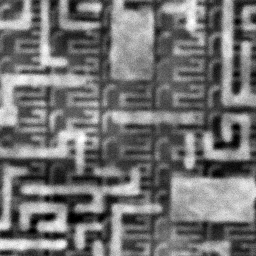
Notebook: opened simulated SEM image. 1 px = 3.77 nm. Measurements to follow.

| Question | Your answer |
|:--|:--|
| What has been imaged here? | wiring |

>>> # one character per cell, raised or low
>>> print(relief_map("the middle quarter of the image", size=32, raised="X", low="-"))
------------XXXXXXXXXX----------
------------XXXXXXXXXX----------
------------XXXXXXXXXX----------
XXXXX-------XXXXXXXXXX----------
XXXXX---------------------------
--------------------------------
--------------------------------
--------------------------------
--------------------------------
--------------------------------
--------------------------------
--------------------------------
------------XXXXXXXXXXXXXXXXXXXX
------------XXXXXXXXXXXXXXXXXXXX
-------------XXXXXXXXXXX-XXXXXXX
--------------------------------
--------------------------------
XXXXX--------------------------X
XXXXX--------------------------X
X--XX--------------------------X
---XX--------------------------X
---XX--------------------------X
---XX--------------------------X
---XX-------------------------XX
---XX-------------------------XX
---XX-------------------------XX
---XX---XXXXXX---XX-------------
--------XXXXXX---XX-------------
-----------------XX-------------
-----------------XX--------XXXXX
----------------XXX--------XXXXX
XXXXXXXXXXXXXXXXXXX--------XXXXX